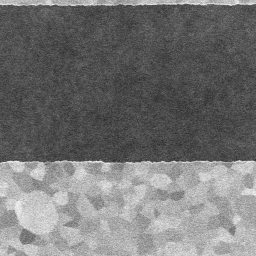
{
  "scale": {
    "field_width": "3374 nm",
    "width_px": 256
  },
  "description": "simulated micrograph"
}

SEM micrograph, one or a few lines or trenches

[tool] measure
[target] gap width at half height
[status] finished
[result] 2080 nm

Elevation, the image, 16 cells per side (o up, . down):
................
................
................
................
................
................
................
................
................
................
oooooooooooooooo
oooooooooooooooo
oooooooooooooooo
oooooooooooooooo
oooooooooooooooo
oooooooooooooooo